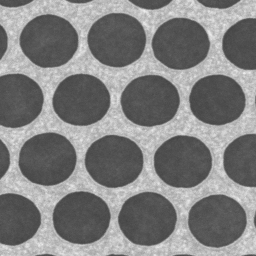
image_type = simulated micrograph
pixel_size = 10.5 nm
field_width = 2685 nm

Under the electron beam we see a regular array of holes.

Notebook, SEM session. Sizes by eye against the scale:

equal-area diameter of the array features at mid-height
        588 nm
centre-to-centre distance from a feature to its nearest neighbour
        0.697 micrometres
